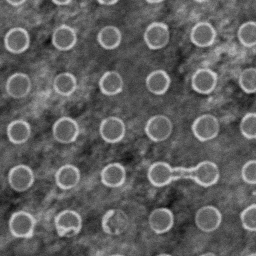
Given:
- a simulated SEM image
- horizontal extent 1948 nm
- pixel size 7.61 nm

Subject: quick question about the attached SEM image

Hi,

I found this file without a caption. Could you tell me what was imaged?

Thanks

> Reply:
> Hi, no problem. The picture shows a regular array of raised bodies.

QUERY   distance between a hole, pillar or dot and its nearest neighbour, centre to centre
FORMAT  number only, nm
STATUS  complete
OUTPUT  349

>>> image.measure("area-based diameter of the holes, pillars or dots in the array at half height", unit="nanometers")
191